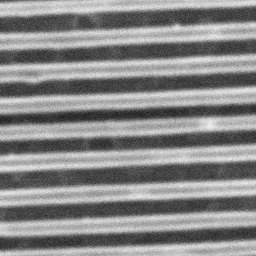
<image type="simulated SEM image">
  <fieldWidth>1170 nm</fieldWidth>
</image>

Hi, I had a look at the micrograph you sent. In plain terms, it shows parallel lines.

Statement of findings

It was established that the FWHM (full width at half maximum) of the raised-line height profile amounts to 59.4 nanometers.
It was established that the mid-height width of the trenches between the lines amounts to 86.8 nanometres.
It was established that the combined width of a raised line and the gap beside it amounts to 143 nanometers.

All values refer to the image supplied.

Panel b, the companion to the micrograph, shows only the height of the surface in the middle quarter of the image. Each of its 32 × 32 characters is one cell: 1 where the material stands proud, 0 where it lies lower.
11111111111111111111111111111111
11111111111111111111111111111111
11111111111111111111111110000000
11000000000000000000000000000000
00000000000000000000000000000000
00000000000000000000000000000000
00000000000000000000000000000000
00000000000000000000000011111111
11111111111111111111111111111111
11111111111111111111111111111111
11111111111111111111000000000000
00000000000000000000000000000000
00000000000000000000000000000000
00000000000000000000000000000000
00000000000000000011111111111111
11111111111111111111111111111111
11111111111111111111111111111111
11111111111111111100000000000000
00000000000000000000000000000000
00000000000000000000000000000000
00000000000000000000000000000000
00000000000000000000000000000001
00011111111111111111111111111111
11111111111111111111111111111111
11111111111111111111111111000000
11111111100000000000000000000000
00000000000000000000000000000000
00000000000000000000000000000000
00000000000000000000000000000000
00000000000000000000000000000000
00000000000000000011111111111111
11111111111111111111111111111111